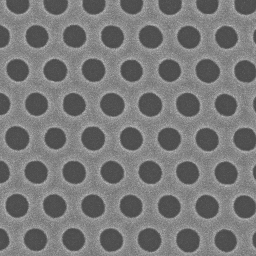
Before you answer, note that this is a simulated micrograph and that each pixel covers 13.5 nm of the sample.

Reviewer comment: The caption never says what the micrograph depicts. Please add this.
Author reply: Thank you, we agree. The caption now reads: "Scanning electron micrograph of a regular array of holes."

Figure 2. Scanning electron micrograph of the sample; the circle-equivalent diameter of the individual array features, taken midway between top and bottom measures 325 nanometers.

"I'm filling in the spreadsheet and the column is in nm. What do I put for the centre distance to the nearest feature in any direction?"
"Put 511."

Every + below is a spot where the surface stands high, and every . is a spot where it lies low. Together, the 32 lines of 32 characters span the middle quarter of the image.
.+++......++++.....+++++.....+++
.+++.......+++......+++......+++
.++++.....++++......++++.....+++
+++++.....+++++....+++++.....+++
+++++++.+++++++++++++++++..+++++
++++++++++++++++++++++++++++++++
++++++++++++++++++++++++++++++++
+...++++++...+++++++...++++++...
.....++++......++++.....++++....
.....++++......+++.......+++....
......+++......+++.......+++....
.....++++......++++.....++++....
+....+++++....++++++....+++++...
++++++++++++++++++++++++++++++++
++++++++++++++++++++++++++++++++
++++++++++++++++++++++++++++++++
+++++....++++++....+++++....++++
+++++.....++++.....+++++.....+++
.+++......++++......+++......+++
.+++......++++......++++.....+++
+++++.....++++.....+++++.....+++
++++++..++++++++..+++++++...++++
++++++++++++++++++++++++++++++++
++++++++++++++++++++++++++++++++
+...++++++...+++++++...+++++++..
.....++++......++++.....++++....
.....++++......++++......+++....
......+++......++++......+++....
.....++++......++++.....++++....
+...+++++++...++++++....+++++...
++++++++++++++++++++++++++++++++
++++++++++++++++++++++++++++++++